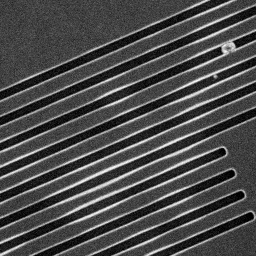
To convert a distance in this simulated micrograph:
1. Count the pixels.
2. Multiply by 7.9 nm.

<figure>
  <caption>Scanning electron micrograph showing groups of lines, slits or small figures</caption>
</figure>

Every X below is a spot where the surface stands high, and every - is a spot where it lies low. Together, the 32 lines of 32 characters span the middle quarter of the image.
----XXXXXXXXX------XXXXXXXXX----
--XXXXXXXXX------XXXXXXXX------X
XXXXXXXX-------XXXXXXXX------XXX
XXXXXX------XXXXXXXXX-----XXXXXX
XXXX------XXXXXXXXX-----XXXXXXXX
XX------XXXXXXXX------XXXXXXXXX-
-----XXXXXXXX------XXXXXXXXX----
---XXXXXXXX------XXXXXXXXX------
-XXXXXXXX------XXXXXXXXX------XX
XXXXXXX------XXXXXXXXX------XXXX
XXXXX-----XXXXXXXXX------XXXXXXX
XXX-----XXXXXXXXX------XXXXXXXX-
------XXXXXXXXX------XXXXXXXX---
---XXXXXXXXX------XXXXXXXXX-----
-XXXXXXXXX------XXXXXXXXX------X
XXXXXXXX------XXXXXXXX------XXXX
XXXXXX-----XXXXXXXXX------XXXXXX
XXX------XXXXXXXX-------XXXXXXXX
X-----XXXXXXXXX-------XXXXXXXX--
----XXXXXXXXX------XXXXXXXXX----
--XXXXXXXXX------XXXXXXXX-------
XXXXXXXXX------XXXXXXXX-------XX
XXXXXX------XXXXXXXXX-------XXXX
XXXX------XXXXXXXXX------XXXXXXX
X-------XXXXXXXX------XXXXXXXX--
------XXXXXXX-------XXXXXXXX----
---XXXXXXXX-------XXXXXXXX------
-XXXXXXXX-------XXXXXXXX------XX
XXXXXX--------XXXXXXXX------XXXX
XXXX--------XXXXXXX-------XXXXXX
XX-------XXXXXXXX------XXXXXXXXX
-------XXXXXXX-------XXXXXXXX---